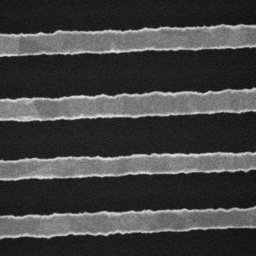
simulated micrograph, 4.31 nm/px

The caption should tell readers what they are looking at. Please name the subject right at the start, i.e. lines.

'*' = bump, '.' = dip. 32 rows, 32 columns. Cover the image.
................................
................................
................................
....................**.*********
********************************
********************************
***************.................
................................
................................
................................
................................
..........................******
********************************
********************************
******************..............
................................
................................
................................
................................
................****************
********************************
************************.**.....
**..............................
................................
................................
................................
............**..****************
********************************
*****************************...
*******.........................
................................
................................